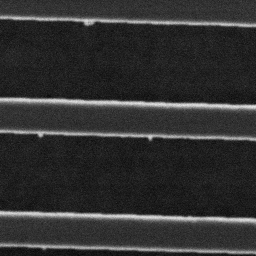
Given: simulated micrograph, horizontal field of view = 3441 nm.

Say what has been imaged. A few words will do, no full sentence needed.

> lines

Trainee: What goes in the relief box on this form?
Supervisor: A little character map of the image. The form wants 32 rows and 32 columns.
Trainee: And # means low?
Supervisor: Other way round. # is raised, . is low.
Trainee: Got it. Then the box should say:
################################
################################
.........#######################
................................
................................
................................
................................
................................
................................
................................
................................
................................
########........................
################################
################################
################################
################################
................................
................................
................................
................................
................................
................................
................................
................................
................................
................................
################################
################################
################################
################################
........................########